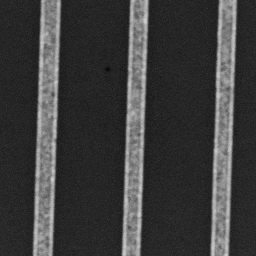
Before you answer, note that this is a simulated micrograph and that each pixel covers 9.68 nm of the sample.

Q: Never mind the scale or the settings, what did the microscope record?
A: one or a few lines or trenches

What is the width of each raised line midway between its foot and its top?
140 nanometres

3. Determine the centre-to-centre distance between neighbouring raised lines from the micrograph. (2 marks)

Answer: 855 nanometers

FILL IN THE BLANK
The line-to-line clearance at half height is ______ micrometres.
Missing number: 0.717